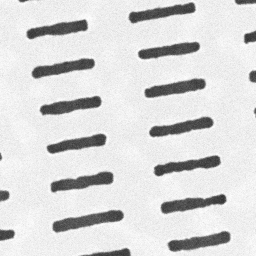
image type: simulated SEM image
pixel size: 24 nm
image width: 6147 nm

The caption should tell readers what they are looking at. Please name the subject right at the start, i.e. a regular array of holes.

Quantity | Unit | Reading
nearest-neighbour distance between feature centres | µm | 0.926